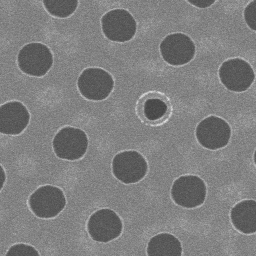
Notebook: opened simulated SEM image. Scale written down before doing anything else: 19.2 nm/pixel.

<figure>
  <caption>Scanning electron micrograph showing a regular array of holes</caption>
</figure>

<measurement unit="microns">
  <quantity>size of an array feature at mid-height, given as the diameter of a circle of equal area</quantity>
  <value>0.665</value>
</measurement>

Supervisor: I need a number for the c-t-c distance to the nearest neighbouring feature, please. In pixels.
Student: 62.7